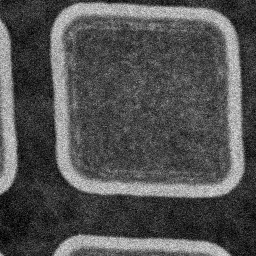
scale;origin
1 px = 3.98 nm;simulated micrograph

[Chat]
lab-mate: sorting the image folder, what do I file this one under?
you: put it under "raised bodies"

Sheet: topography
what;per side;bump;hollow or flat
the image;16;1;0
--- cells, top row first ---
0000000000000000
0000111111111100
0000111111111100
0000111111111100
0000111111111110
0000111111111110
0000111111111110
0000111111111110
1000111111111110
1000111111111110
1000111111111110
0000011111111100
0000000000000000
0000000000000000
0000000000000000
0000111111111000